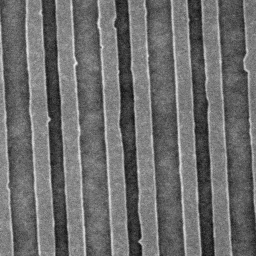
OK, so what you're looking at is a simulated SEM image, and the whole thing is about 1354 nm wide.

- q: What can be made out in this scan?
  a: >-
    parallel lines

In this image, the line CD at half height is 16.1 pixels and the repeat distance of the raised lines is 186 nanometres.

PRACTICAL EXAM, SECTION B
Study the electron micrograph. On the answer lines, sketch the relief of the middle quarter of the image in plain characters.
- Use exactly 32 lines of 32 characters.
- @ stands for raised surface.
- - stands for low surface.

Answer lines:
@@@-------@@@----@@@@-------@@@@
@@@-------@@@----@@@@-------@@@@
@@@-------@@@@---@@@@-------@@@@
@@@-------@@@@---@@@@-------@@@@
@@@-------@@@@---@@@@-------@@@@
@@@-------@@@@---@@@@-------@@@@
@@@-------@@@@----@@@-------@@@@
@@@-------@@@@----@@@-------@@@@
@@@-------@@@@----@@@-------@@@@
@@@-------@@@@----@@@@------@@@@
@@@-------@@@@----@@@@------@@@@
@@@-------@@@@----@@@@------@@@@
@@@@------@@@@----@@@@------@@@@
@@@@------@@@@----@@@@------@@@@
@@@-------@@@@----@@@@-------@@@
@@@@------@@@@----@@@@-------@@@
@@@@------@@@@----@@@@-------@@@
@@@@------@@@@----@@@@-------@@@
@@@@------@@@@----@@@@-------@@@
@@@@------@@@@----@@@@-------@@@
@@@@-------@@@@---@@@@-------@@@
@@@@-------@@@@---@@@@-------@@@
@@@@-------@@@@---@@@@-------@@@
@@@@-------@@@@---@@@@-------@@@
@@@@-------@@@@---@@@@-------@@@
@@@@-------@@@@---@@@@@------@@@
@@@@-------@@@@---@@@@-------@@@
@@@@-------@@@@----@@@@------@@@
@@@@-------@@@@----@@@@------@@@
@@@@-------@@@@----@@@@------@@@
@@@@-------@@@@----@@@@------@@@
@@@@-------@@@@----@@@@------@@@